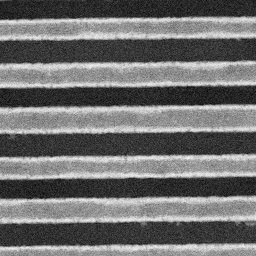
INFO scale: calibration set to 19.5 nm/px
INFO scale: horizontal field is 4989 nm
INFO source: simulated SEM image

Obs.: lines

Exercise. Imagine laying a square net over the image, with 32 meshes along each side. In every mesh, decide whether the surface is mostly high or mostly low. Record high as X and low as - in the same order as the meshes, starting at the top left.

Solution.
--------------------------------
--------------------------------
----XXXXXXXXXXXXXXXXXXXXXXXXXXXX
XXXXXXXXXXXXXXXXXXXXXXXXXXXXXXXX
XXXXXXXXXXXXXXXXXXXXXXXXXXXXXXXX
--------------------------------
--------------------------------
--------------------------------
XXXXXXXXXXXXXXXXXXXXXXXXXXXXXXXX
XXXXXXXXXXXXXXXXXXXXXXXXXXXXXXXX
XXXXXXXXXXXXXXXXXXXXXXXXXXXXXXXX
--------------------------------
--------------------------------
-XXXXXXXXXXXXXXXXXXXXXXXXXXXXXXX
XXXXXXXXXXXXXXXXXXXXXXXXXXXXXXXX
XXXXXXXXXXXXXXXXXXXXXXXXXXXXXXXX
XXXXXXXXXXXXXXX-----------------
--------------------------------
--------------------------------
--------------------XXXXXXXXXXXX
XXXXXXXXXXXXXXXXXXXXXXXXXXXXXXXX
XXXXXXXXXXXXXXXXXXXXXXXXXXXXXXXX
--------------------------------
--------------------------------
--------------------------------
XXXXXXXXXXXXXXXXXXXXXXXXXXXXXXXX
XXXXXXXXXXXXXXXXXXXXXXXXXXXXXXXX
XXXXXXXXXXXXXXXXXXXXXXXXXX------
--------------------------------
--------------------------------
--------------------------------
XXXXXXXXXXXXXXXXXXXXXXXXXXXXXXXX